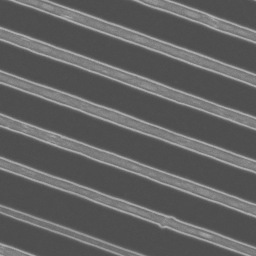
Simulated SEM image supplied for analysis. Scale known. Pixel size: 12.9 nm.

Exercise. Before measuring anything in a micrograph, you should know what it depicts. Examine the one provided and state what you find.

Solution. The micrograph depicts parallel lines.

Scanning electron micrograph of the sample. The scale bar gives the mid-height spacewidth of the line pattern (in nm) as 125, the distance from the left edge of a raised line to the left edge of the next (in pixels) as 41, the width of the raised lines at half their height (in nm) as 397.